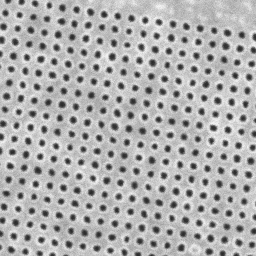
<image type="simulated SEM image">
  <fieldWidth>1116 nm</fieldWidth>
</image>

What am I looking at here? a regular array of holes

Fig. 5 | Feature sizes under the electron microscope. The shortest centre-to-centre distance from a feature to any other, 58.6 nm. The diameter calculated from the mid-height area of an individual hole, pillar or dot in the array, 32.3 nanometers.